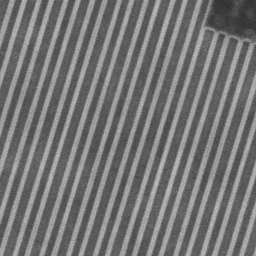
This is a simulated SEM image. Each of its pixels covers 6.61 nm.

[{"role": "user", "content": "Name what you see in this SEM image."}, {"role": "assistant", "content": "parallel lines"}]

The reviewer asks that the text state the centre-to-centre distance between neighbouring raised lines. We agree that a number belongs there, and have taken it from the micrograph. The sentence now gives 84.6 nanometers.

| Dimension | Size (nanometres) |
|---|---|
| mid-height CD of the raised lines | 22.9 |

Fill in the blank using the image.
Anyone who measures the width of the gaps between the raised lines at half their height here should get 56.8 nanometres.